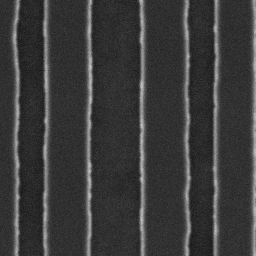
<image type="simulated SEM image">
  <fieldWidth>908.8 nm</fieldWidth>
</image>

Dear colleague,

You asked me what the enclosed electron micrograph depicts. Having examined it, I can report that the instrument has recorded lines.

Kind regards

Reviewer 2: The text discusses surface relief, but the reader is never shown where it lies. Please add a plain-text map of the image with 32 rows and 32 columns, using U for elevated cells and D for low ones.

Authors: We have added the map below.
UUDDDDUUUUUDDDDDDDUUUUUDDDDUUUUU
UUDDDDUUUUUDDDDDDDUUUUUDDDDUUUUU
UUDDDDUUUUUDDDDDDDUUUUUDDDDUUUUU
UUDDDDUUUUUDDDDDDDUUUUUDDDDUUUUU
UUDDDDUUUUUDDDDDDDUUUUUDDDDUUUUU
UUDDDDUUUUUDDDDDDDUUUUUDDDDUUUUU
UUDDDDUUUUUDDDDDDDUUUUUUDDDUUUUU
UUDDDDUUUUUDDDDDDDUUUUUUDDDUUUUU
UUDDDDUUUUUDDDDDDDUUUUUUDDDUUUUU
UUDDDDUUUUUDDDDDDDUUUUUDDDDUUUUU
UUDDDDUUUUUDDDDDDDUUUUUDDDDUUUUU
UUDDDDUUUUUDDDDDDDUUUUUDDDDUUUUU
UUDDDDUUUUUDDDDDDDUUUUUDDDDUUUUU
UUDDDDUUUUUDDDDDDDUUUUUDDDDUUUUU
UUDDDDUUUUUDDDDDDDUUUUUUDDDUUUUU
UUDDDDUUUUUDDDDDDDUUUUUUDDDUUUUU
UUDDDDUUUUUDDDDDDDUUUUUDDDDUUUUU
UUDDDDUUUUUDDDDDDDUUUUUDDDDUUUUU
UUDDDDUUUUUDDDDDDDUUUUUDDDDUUUUU
UUDDDDUUUUUDDDDDDDUUUUUUDDDUUUUU
UUDDDDUUUUUDDDDDDDUUUUUUDDDUUUUU
UUDDDDUUUUUDDDDDDDUUUUUUDDDUUUUU
UUDDDDUUUUUDDDDDDDUUUUUUDDDUUUUU
UUDDDDUUUUUDDDDDDDUUUUUUDDDUUUUU
UUDDDDUUUUUDDDDDDDUUUUUDDDDUUUUU
UUDDDDUUUUUDDDDDDDUUUUUDDDDUUUUU
UUDDDDUUUUUDDDDDDDUUUUUUDDDUUUUU
UUDDDDUUUUUDDDDDDDUUUUUUDDDUUUUU
UUDDDDUUUUUDDDDDDDUUUUUUDDDUUUUU
UUDDDDUUUUUDDDDDDDUUUUUUDDDUUUUU
UUDDDDUUUUUDDDDDDDUUUUUDDDDUUUUU
UUDDDDUUUUUDDDDDDDUUUUUDDDDUUUUU